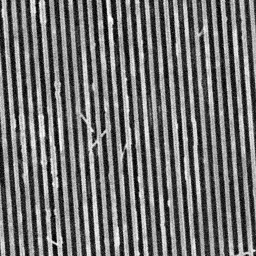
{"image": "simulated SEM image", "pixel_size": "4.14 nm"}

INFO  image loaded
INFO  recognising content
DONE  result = parallel lines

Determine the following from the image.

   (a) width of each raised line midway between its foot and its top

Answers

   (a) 0.0145 um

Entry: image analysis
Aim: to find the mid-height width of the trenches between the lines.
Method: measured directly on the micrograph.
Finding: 0.0222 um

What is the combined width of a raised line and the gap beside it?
39.4 nanometers